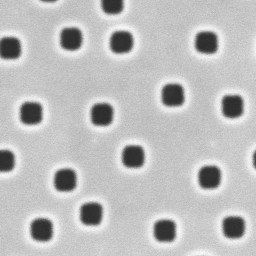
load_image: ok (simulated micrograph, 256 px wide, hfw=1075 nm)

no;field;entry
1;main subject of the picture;a regular array of holes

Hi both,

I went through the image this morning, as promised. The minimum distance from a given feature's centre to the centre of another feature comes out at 0.226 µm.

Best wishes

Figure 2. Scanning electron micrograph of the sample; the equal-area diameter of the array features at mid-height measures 106 nm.